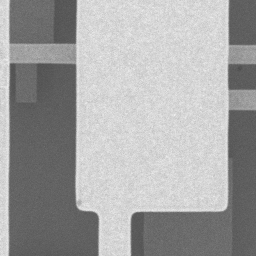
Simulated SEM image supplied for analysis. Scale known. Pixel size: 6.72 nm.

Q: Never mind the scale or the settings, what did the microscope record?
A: wiring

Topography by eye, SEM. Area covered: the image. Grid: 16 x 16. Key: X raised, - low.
X----XXXXXXXXX--
X----XXXXXXXXX--
X----XXXXXXXXX--
X----XXXXXXXXX--
X----XXXXXXXXX--
X----XXXXXXXXX--
X----XXXXXXXXX--
X----XXXXXXXXX--
X----XXXXXXXXX--
X----XXXXXXXXX--
X----XXXXXXXXX--
-----XXXXXXXXX--
-----XXXXXXXXX--
------XX--------
X-----XX--------
X-----XX--------